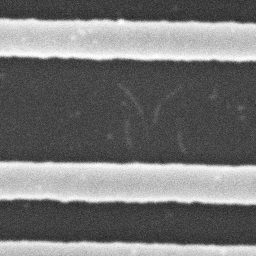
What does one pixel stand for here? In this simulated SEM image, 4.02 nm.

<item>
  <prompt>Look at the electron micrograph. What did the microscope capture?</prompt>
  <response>lines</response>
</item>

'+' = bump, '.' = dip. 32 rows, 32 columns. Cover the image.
................................
................................
+..+............................
++++++++++++++++++++++++++++++++
++++++++++++++++++++++++++++++++
++++++++++++++++++++++++++++++++
++++++++++++++++++++++++++++++++
.......................+...+++++
................................
................................
................................
................................
................................
................................
................................
................................
................................
................................
................................
................................
+++++.+.........................
++++++++++++++++++++++++++++++++
++++++++++++++++++++++++++++++++
++++++++++++++++++++++++++++++++
++++++++++++++++++++++++++++++++
................................
................................
................................
................................
................................
++++++++++++..++................
++++++++++++++++++++++++++++++++